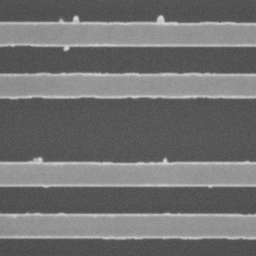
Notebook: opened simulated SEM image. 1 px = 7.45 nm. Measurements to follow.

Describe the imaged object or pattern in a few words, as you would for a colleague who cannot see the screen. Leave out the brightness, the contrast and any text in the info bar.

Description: lines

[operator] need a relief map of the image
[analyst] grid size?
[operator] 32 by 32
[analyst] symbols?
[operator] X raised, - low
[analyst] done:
--------------------------------
--------------------------------
--------------------------------
XXXXXXXXXXXXXXXXXXXXXXXXXXXXXXXX
XXXXXXXXXXXXXXXXXXXXXXXXXXXXXXXX
XXXXXXXXXXXXXXXXXXXXXXXXXXXXXXXX
--------------------------------
--------------------------------
--------------------------------
XXXXXXXXXXXXXXXXXXXXXXXXXXXXXXXX
XXXXXXXXXXXXXXXXXXXXXXXXXXXXXXXX
XXXXXXXXXXXXXXXXXXXXXXXXXXXXXXXX
--------------------------------
--------------------------------
--------------------------------
--------------------------------
--------------------------------
--------------------------------
--------------------------------
--------------------------------
XXXXXXXXXXXXXXXXXXXXXXXXXXXXXXXX
XXXXXXXXXXXXXXXXXXXXXXXXXXXXXXXX
XXXXXXXXXXXXXXXXXXXXXXXXXXXXXXXX
--------------------------------
--------------------------------
--------------------------------
--------------------------------
XXXXXXXXXXXXXXXXXXXXXXXXXXXXXXXX
XXXXXXXXXXXXXXXXXXXXXXXXXXXXXXXX
XXXXXXXXXXXXXXXXXXXXXXXXXXXXXXXX
--------------------------------
--------------------------------